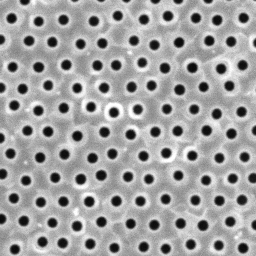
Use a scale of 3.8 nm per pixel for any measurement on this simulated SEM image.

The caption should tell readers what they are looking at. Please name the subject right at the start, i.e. a regular array of holes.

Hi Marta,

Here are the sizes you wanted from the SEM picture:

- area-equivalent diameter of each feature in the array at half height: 43.3 nanometres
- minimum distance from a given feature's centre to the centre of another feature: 85.7 nm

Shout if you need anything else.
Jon